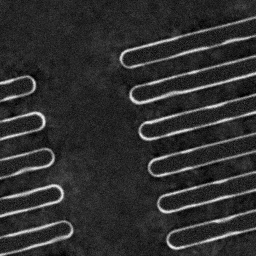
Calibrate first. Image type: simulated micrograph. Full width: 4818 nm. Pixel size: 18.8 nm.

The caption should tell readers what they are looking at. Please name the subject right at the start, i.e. groups of lines, slits or small figures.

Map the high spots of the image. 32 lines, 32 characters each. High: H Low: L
LLLLLLLLLLLLLLLLLLLLLLLLLLLLLLLL
LLLLLLLLLLLLLLLLLLLLLLLLLLLLLLLL
LLLLLLLLLLLLLLLLLLLLLLLLLLLLLLLH
LLLLLLLLLLLLLLLLLLLLLLLLLLLHHHHH
LLLLLLLLLLLLLLLLLLLLLLLHHHHHHHHH
LLLLLLLLLLLLLLLLLLLHHHHHHHHHLLLL
LLLLLLLLLLLLLLLLHHHHHHHLLLLLLLLL
LLLLLLLLLLLLLLLHHHHHLLLLLLLLLLHH
LLLLLLLLLLLLLLLLLLLLLLLLLLHHHHHH
LLLLLLLLLLLLLLLLLLLLLLHHHHHHHHHL
HHHHLLLLLLLLLLLLLLLHHHHHHHHLLLLL
HHHHLLLLLLLLLLLLHHHHHHHLLLLLLLLL
HLLLLLLLLLLLLLLLLHHLLLLLLLLLLHHH
LLLLLLLLLLLLLLLLLLLLLLLLLHHHHHHH
LLLHHLLLLLLLLLLLLLLLLLHHHHHHHHLL
HHHHHLLLLLLLLLLLLLHHHHHHHHHLLLLL
HHHHLLLLLLLLLLLLLLHHHHLLLLLLLLLL
LLLLLLLLLLLLLLLLLLLLLLLLLLLLLHHH
LLLLLLLLLLLLLLLLLLLLLLLLLHHHHHHH
LLHHHHHLLLLLLLLLLLLLLHHHHHHHHHLL
HHHHHHLLLLLLLLLLLLLHHHHHHHLLLLLL
HHLLLLLLLLLLLLLLLLLHHHLLLLLLLLLL
LLLLLLLLLLLLLLLLLLLLLLLLLLLLHHHH
LLLLLLHLLLLLLLLLLLLLLLLLHHHHHHHH
LLHHHHHHLLLLLLLLLLLLLHHHHHHHHLLL
HHHHHHLLLLLLLLLLLLLLHHHHHLLLLLLL
HHLLLLLLLLLLLLLLLLLLLLLLLLLLLLLH
LLLLLLLLLLLLLLLLLLLLLLLLLLLLHHHH
LLLLLHHHHLLLLLLLLLLLLLLHHHHHHHHH
LHHHHHHHLLLLLLLLLLLLLHHHHHHHLLLL
HHHHHLLLLLLLLLLLLLLLLHHHLLLLLLLL
HHLLLLLLLLLLLLLLLLLLLLLLLLLLLLLL